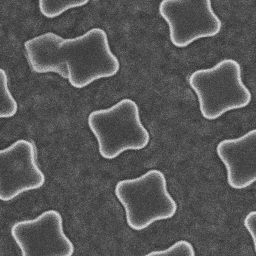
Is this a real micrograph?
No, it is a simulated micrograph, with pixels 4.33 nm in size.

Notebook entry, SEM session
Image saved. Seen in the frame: raised bodies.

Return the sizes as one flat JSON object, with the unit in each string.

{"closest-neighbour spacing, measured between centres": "348 nm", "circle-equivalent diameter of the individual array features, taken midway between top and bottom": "231 nanometres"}